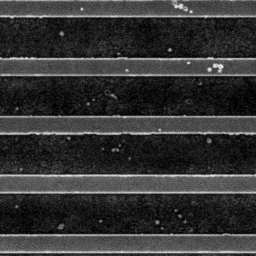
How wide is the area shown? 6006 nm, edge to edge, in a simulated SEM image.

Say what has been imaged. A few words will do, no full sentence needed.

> lines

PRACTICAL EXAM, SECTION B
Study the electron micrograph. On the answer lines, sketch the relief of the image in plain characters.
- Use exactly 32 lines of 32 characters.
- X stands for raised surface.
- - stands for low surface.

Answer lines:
XXXXXXXXXXXXXXXXXXXXXXXXXXXXXXXX
XXXXXXXXXXXXXXXXXXXXXXXXXXXXXXXX
--------------------------------
--------------------------------
--------------------------------
--------------------------------
--------------------------------
XXXXXXXXXXXXXXXXXXXXXXXXXXXXXXXX
XXXXXXXXXXXXXXXXXXXXXXXXXXXXXXXX
--------------------------------
--------------------------------
--------------------------------
--------------------------------
--------------------------------
-------X------X--------X--------
XXXXXXXXXXXXXXXXXXXXXXXXXXXXXXXX
XXXXXXXXXXXXXXXXXXXXXXXXXXXXXXXX
--------------------------------
--------------------------------
--------------------------------
--------------------------------
--------------------------------
XXXXXXXXXXXXXXXXXXXXXXXXXXXXXXXX
XXXXXXXXXXXXXXXXXXXXXXXXXXXXXXXX
--------------------------------
--------------------------------
--------------------------------
--------------------------------
--------------------------------
XXXXXXXXXXXXXXXXXXXXXXXXXXXXXXXX
XXXXXXXXXXXXXXXXXXXXXXXXXXXXXXXX
XXXXXXXXXXXXXXXXXXXXXXXXXXXXXXXX